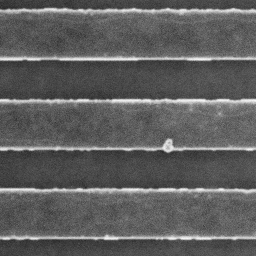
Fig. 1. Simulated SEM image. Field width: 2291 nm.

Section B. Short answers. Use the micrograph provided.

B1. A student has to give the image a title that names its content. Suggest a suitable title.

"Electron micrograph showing lines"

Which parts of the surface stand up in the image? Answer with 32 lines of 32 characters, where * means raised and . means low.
................................
********************************
********************************
********************************
********************************
********************************
********************************
................................
................................
................................
................................
................................
....................*...........
********************************
********************************
********************************
********************************
********************************
********************************
................................
................................
................................
................................
................................
********************************
********************************
********************************
********************************
********************************
********************************
................................
................................